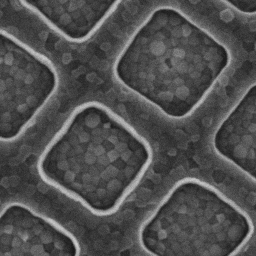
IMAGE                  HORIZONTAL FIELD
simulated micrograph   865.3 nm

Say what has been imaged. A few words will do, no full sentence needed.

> holes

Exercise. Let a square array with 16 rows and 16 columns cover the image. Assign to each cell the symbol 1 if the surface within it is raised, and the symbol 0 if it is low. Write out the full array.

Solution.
1100000111111110
1110001110001111
0111111100000111
0011111100000011
0001111000000011
0001111100000111
0001111111001110
0011100111111100
0111000011111100
1110000001111100
1110000001111110
1111000011101111
1111100111000011
0011111111000001
0000111110000000
0000011110000001